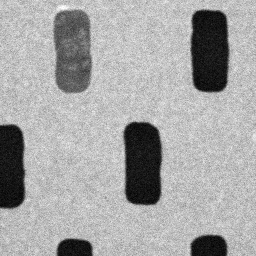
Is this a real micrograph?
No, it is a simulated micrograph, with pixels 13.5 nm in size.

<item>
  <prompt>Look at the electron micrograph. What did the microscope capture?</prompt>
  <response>holes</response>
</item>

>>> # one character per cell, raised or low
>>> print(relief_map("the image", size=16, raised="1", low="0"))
1111111111111111
1110001111110011
1110001111110011
1110001111110011
1110001111110011
1111011111110011
1111111111111111
1111111111111111
0111111100111111
0011111100111111
0011111100111111
0011111100111111
0111111100111111
1111111111111111
1111111111111111
1111001111110011